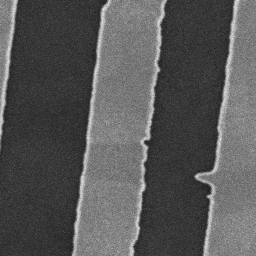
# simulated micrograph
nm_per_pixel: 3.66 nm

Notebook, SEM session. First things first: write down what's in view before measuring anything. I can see one or a few lines or trenches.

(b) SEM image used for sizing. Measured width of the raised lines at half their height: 220 nm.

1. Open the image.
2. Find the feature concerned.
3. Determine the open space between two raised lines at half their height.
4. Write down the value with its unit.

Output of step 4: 263 nm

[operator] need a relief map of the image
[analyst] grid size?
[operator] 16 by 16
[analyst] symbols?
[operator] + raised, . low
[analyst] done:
+......+++.....+
+.....++++.....+
+.....++++....++
+.....++++....++
......++++....++
......++++....++
......++++....++
......+++.....++
......+++.....++
.....++++.....++
.....++++....+++
.....++++....+++
.....++++....+++
.....++++....+++
.....++++....+++
.....+++.....+++